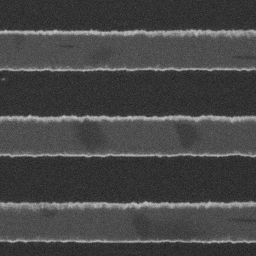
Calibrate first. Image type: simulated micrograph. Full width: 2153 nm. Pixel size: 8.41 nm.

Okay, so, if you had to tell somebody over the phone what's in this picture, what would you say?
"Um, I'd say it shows lines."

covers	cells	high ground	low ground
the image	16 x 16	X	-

----------------
----------------
XXXXXXXXXXXXXXXX
XXXXXXXXXXXXXXXX
----------------
----------------
----------------
XXXXXXXXXXXXXXXX
XXXXXXXXXXXXXXXX
XXXXXXXXXXXXXXXX
----------------
----------------
----------------
XXXXXXXXXXXXXXXX
XXXXXXXXXXXXXXXX
----------------